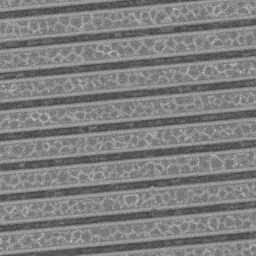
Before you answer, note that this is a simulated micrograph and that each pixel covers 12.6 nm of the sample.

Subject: parallel lines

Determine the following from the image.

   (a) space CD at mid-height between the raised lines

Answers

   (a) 11.1 pixels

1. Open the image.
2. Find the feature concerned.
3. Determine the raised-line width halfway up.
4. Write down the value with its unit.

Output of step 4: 0.236 microns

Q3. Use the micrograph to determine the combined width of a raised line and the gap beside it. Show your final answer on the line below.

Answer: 381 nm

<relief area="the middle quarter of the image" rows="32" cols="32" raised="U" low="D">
DDDDDDDDDDDDDDDDDDDDDDDDDDDDDUUU
DDDDDDDDDDDDDDDDDDUUUUUUUUUUUUUU
DDDDDDDDUUUUUUUUUUUUUUUUUUUUUUUU
UUUUUUUUUUUUUUUUUUUUUUUUUUUUUUUU
UUUUUUUUUUUUUUUUUUUUUUUUUUUUUUUU
UUUUUUUUUUUUUUUUUUUUUUUUDDDDDDDD
UUUUUUUUUUUDDDDDDDDDDDDDDDDDDDDD
UUUDDDDDDDDDDDDDDDDDDDDDDDDDDDDD
DDDDDDDDDDDDDDDDDDDDDDDDUUUUUUUU
DDDDDDDDDDDDDUUUUUUUUUUUUUUUUUUU
DDUUUUUUUUUUUUUUUUUUUUUUUUUUUUUU
UUUUUUUUUUUUUUUUUUUUUUUUUUUUUUUU
UUUUUUUUUUUUUUUUUUUUUUUUUUUUUDDD
UUUUUUUUUUUUUUUUUUUDDDDDDDDDDDDD
UUUUUUUUDDDDDDDDDDDDDDDDDDDDDDDD
DDDDDDDDDDDDDDDDDDDDDDDDDDDDDDDU
DDDDDDDDDDDDDDDDDDDDDUUUUUUUUUUU
DDDDDDDDDDUUUUUUUUUUUUUUUUUUUUUU
UUUUUUUUUUUUUUUUUUUUUUUUUUUUUUUU
UUUUUUUUUUUUUUUUUUUUUUUUUUUUUUUU
UUUUUUUUUUUUUUUUUUUUUUUUUUDDDDDD
UUUUUUUUUUUUUUUUDDDDDDDDDDDDDDDD
UUUUUDDDDDDDDDDDDDDDDDDDDDDDDDDD
DDDDDDDDDDDDDDDDDDDDDDDDDDUUUUUU
DDDDDDDDDDDDDDDUUUUUUUUUUUUUUUUU
DDDDDUUUUUUUUUUUUUUUUUUUUUUUUUUU
UUUUUUUUUUUUUUUUUUUUUUUUUUUUUUUU
UUUUUUUUUUUUUUUUUUUUUUUUUUUUUUUU
UUUUUUUUUUUUUUUUUUUUUDDDDDDDDDDD
UUUUUUUUUUDDDDDDDDDDDDDDDDDDDDDD
DDDDDDDDDDDDDDDDDDDDDDDDDDDDDDDU
DDDDDDDDDDDDDDDDDDDDDUUUUUUUUUUU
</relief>